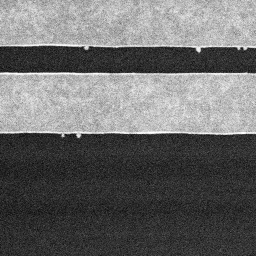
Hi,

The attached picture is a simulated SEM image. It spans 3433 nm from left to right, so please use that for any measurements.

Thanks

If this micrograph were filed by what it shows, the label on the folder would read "wiring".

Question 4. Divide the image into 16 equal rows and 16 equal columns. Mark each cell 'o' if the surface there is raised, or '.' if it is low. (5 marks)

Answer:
oooooooooooooooo
oooooooooooooooo
oooooooooooooooo
................
................
oooooooooooooooo
oooooooooooooooo
oooooooooooooooo
................
................
................
................
................
................
................
................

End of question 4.